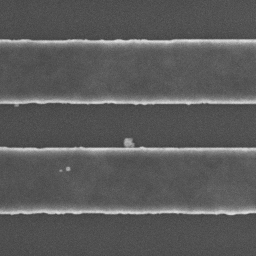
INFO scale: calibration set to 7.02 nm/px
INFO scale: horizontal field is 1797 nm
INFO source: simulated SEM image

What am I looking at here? lines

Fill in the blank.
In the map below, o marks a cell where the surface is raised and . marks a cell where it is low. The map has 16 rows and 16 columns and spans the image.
................
................
oo..oo..o..ooooo
oooooooooooooooo
oooooooooooooooo
oooooooooooooooo
................
................
................
oooooooooooooooo
oooooooooooooooo
oooooooooooooooo
oooooooooooooooo
................
................
................